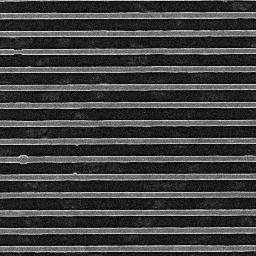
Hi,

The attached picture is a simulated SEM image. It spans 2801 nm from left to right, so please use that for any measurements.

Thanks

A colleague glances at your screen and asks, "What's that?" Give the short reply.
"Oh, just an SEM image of parallel lines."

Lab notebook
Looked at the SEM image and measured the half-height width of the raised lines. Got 58.8 nm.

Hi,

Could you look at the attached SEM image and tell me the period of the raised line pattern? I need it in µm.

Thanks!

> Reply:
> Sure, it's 0.196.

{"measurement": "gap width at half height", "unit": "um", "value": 0.134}